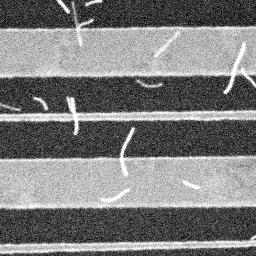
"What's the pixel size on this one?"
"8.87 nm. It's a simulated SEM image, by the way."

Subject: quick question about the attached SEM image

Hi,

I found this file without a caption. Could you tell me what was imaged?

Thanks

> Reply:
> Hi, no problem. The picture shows lines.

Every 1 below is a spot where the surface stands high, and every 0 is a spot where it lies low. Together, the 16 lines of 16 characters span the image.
0000000000000000
0000000000000000
1111111111111111
1111111111111111
1111111111111111
0000000000000000
0000000000000000
0000000000000000
0000000000000000
0000000000000000
1111111111111111
1111111111111111
1111111111111111
0000000000000000
0000000000000000
0000000000000000